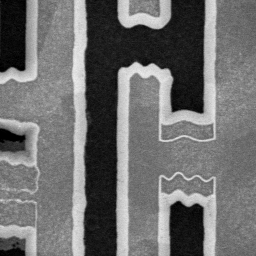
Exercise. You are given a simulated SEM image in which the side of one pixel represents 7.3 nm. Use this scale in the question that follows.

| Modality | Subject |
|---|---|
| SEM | one or a few lines or trenches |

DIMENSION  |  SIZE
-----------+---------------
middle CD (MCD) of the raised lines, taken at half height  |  345 nm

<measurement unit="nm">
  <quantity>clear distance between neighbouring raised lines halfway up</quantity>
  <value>314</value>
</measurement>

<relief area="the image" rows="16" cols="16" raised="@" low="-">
--@@@---@@---@@@
--@@@--------@@@
--@@@--------@@@
--@@@--------@@@
--@@@---@@---@@@
@@@@@---@@---@@@
@@@@@---@@---@@@
@@@@@---@@@@@@@@
--@@@---@@@@@@@@
--@@@---@@@@@@@@
@@@@@---@@@@@@@@
@@@@@---@@@@@@@@
@@@@@---@@@-@@@@
@@@@@---@@---@@@
@@@@@---@@---@@@
--@@@---@@---@@@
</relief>